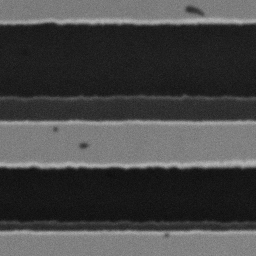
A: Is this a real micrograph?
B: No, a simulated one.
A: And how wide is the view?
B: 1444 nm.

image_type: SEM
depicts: lines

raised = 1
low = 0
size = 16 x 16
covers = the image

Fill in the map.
1111111111111111
0000000001000000
0000000000000000
0000000000000000
0000000000000000
0000000000000000
1111111111111111
1111111111111111
1111111111111111
1111111111111111
0001000000010000
0000000000000000
0000000000000000
0000000000000000
1111111111111111
1111111111111111